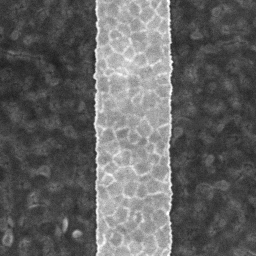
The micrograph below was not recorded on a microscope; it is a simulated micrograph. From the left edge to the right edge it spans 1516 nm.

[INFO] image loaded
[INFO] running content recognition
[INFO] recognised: one or a few lines or trenches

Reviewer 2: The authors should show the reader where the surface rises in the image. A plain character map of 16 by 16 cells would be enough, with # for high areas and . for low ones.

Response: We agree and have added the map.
......#####.....
......#####.....
......#####.....
......#####.....
......#####.....
......#####.....
......#####.....
......#####.....
......#####.....
......#####.....
......#####.....
......#####.....
......#####.....
......#####.....
......#####.....
......#####.....